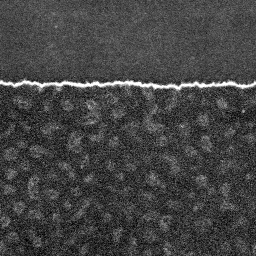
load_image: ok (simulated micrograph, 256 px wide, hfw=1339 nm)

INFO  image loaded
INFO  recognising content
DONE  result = one or a few lines or trenches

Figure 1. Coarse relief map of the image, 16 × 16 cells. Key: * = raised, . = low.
................
................
................
................
................
****************
****************
****************
****************
****************
****************
****************
****************
****************
****************
****************